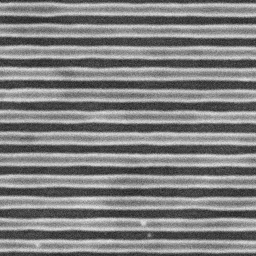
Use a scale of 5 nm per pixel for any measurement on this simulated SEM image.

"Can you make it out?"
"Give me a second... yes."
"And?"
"wiring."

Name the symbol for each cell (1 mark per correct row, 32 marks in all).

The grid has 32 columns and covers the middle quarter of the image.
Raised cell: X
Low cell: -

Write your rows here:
--------------------------------
XXXXXXXXXXXXXXXXXXXXXXXXXXXXXXXX
XXXXXXXXXXXXXXXXXXXXXXXXXXXXXXXX
XXXXXXXXXXXXXXXXXXXXXXXXXXXXXXXX
--------------------------------
--------------------------------
XXXXXXXXXXXXXXXXXXXXX---XXXXX---
XXXXXXXXXXXXXXXXXXXXXXXXXXXXXXXX
XXXXXXXXXXXXXXXXXXXXXXXXXXXXXXXX
--------------------------------
--------------------------------
--------------------------------
XXXXXXXXXXXXXXXXXXXXXXXXXXXXXXXX
XXXXXXXXXXXXXXXXXXXXXXXXXXXXXXXX
XXXXX-------XXXXXXXXXXXXXXXXXXXX
--------------------------------
--------------------------------
XXXXXXXXXXXXXXXXXXXXXXXXXXXX--X-
XXXXXXXXXXXXXXXXXXXXXXXXXXXXXXXX
XXXXXXXXXXXXXXXXXXXXXXXXXXXXXXXX
--------------------------------
--------------------------------
XX---XXXXXX---------------------
XXXXXXXXXXXXXXXXXXXXXXXXXXXXXXXX
XXXXXXXXXXXXXXXXXXXXXXXXXXXXXXXX
--------------------------------
--------------------------------
--------------------------------
XXXXXXXXXXXXXXXXXXXXXXXXXXXXXXXX
XXXXXXXXXXXXXXXXXXXXXXXXXXXXXXXX
-XXXXXXXXXXXXXXXXXXXXXXXXXXXXXXX
--------------------------------